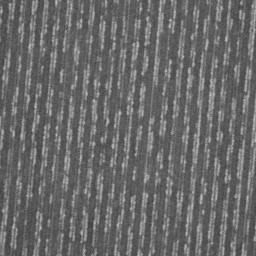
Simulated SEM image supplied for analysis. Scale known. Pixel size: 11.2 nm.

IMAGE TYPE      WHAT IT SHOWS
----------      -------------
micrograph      parallel lines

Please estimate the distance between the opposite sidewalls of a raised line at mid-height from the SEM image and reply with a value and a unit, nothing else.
47.6 nm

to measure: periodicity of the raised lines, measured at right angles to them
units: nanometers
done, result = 130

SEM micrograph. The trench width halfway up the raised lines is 82.7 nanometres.